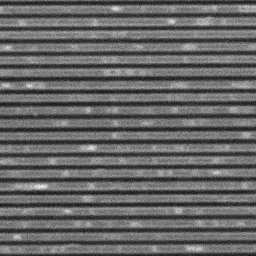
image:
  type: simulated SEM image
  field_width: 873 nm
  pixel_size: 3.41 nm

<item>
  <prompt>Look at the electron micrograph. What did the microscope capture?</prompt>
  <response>parallel lines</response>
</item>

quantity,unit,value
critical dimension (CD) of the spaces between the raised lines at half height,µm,0.0205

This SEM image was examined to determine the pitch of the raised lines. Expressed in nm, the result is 43.1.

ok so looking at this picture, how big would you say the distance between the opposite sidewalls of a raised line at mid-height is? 23.9 nanometres